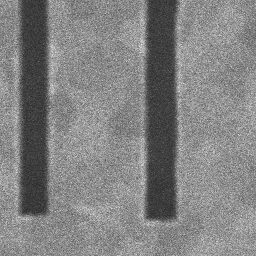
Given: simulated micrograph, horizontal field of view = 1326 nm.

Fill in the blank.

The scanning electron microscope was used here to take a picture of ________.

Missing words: one or a few lines or trenches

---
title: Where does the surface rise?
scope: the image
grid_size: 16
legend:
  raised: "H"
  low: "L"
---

HLLHHHHHHLLHHHHH
HLLHHHHHHLLHHHHH
HLLHHHHHHLLHHHHH
HLLHHHHHHLLHHHHH
HLLHHHHHHLLHHHHH
HLLHHHHHHLLHHHHH
HLLHHHHHHLLHHHHH
HLLHHHHHHLLHHHHH
HLLHHHHHHLLHHHHH
HLLHHHHHHLLHHHHH
HLLHHHHHHLLHHHHH
HLLHHHHHHLLHHHHH
HLLHHHHHHLLHHHHH
HHHHHHHHHLLHHHHH
HHHHHHHHHHHHHHHH
HHHHHHHHHHHHHHHH